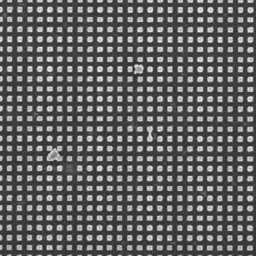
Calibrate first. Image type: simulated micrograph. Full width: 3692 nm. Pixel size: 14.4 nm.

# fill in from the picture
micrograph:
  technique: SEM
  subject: a regular array of raised bodies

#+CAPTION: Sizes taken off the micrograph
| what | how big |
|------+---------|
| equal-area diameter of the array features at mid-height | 5.41 px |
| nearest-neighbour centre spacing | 138 nanometers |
